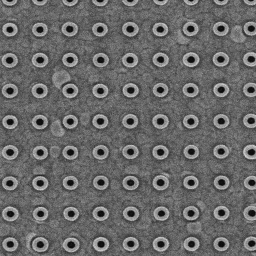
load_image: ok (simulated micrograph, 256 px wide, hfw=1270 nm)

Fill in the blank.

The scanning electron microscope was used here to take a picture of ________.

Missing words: a regular array of ring-shaped raised bodies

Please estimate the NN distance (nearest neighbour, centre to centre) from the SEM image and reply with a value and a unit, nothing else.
0.148 µm